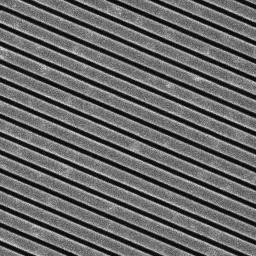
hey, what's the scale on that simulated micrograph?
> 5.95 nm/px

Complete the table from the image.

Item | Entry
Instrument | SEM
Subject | parallel lines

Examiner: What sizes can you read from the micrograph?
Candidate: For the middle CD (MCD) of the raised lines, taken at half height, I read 0.0733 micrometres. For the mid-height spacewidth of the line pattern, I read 0.028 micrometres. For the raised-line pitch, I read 0.0993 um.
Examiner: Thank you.